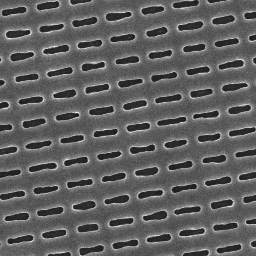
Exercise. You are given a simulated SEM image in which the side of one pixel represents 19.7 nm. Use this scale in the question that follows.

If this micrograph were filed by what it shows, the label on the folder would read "a regular array of holes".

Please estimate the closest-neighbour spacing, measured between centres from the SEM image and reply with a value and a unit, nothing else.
444 nm